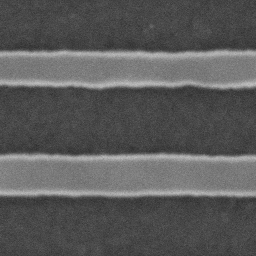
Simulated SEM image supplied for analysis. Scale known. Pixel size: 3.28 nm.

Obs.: lines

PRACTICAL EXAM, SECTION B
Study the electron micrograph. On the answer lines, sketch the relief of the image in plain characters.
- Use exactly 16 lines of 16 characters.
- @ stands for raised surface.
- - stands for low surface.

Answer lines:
----------------
----------------
----------------
@@@@@@@@@@@@@@@@
@@@@@@@@@@@@@@@@
----------------
----------------
----------------
----------------
----------------
@@@@@@@@@@@@@@@@
@@@@@@@@@@@@@@@@
----------------
----------------
----------------
----------------